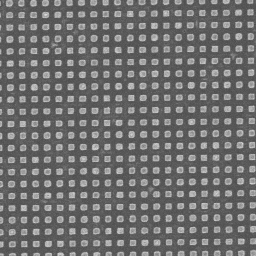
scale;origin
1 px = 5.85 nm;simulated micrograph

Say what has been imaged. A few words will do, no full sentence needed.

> a regular array of raised bodies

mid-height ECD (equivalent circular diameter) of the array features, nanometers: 39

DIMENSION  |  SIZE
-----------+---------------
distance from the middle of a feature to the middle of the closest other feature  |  0.0687 µm